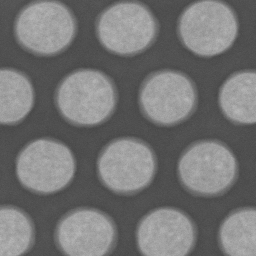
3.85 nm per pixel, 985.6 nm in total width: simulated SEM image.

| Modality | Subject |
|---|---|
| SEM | raised bodies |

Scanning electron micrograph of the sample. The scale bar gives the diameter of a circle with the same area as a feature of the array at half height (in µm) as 0.215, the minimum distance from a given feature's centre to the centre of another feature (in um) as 0.307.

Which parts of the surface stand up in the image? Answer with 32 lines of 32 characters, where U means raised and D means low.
DDDDUUUUDDDDDDDUUDDDDDDDUUUUDDDD
DDDUUUUUUDDDDUUUUUUDDDDUUUUUUDDD
DDUUUUUUUDDDUUUUUUUDDDDUUUUUUDDD
DDUUUUUUUDDDUUUUUUUUDDUUUUUUUUDD
DDUUUUUUUDDDUUUUUUUDDDDUUUUUUDDD
DDDUUUUUUDDDDUUUUUUDDDDUUUUUUDDD
DDDDUUUDDDDDDDUUUDDDDDDDUUUUDDDD
DDDDDDDDDDDDDDDDDDDDDDDDDDDDDDDD
DDDDDDDDDDDDDDDDDDDDDDDDDDDDDDDD
UUUDDDDDDUUUUDDDDDDUUUUDDDDDDUUU
UUUUDDDDUUUUUUDDDDUUUUUUDDDDUUUU
UUUUDDDUUUUUUUDDDDUUUUUUDDDDUUUU
UUUUDDDUUUUUUUDDDDUUUUUUDDDUUUUU
UUUUDDDUUUUUUUDDDDUUUUUUDDDDUUUU
UUUDDDDDUUUUUUDDDDUUUUUDDDDDUUUU
DDDDDDDDDDUUDDDDDDDDUDDDDDDDDDDD
DDDDDDDDDDDDDDDDDDDDDDDDDDDDDDDD
DDDDDUDDDDDDDDDUUDDDDDDDDDDDDDDD
DDDUUUUUDDDDDUUUUUUDDDDDUUUUDDDD
DDUUUUUUUDDDDUUUUUUDDDDUUUUUUDDD
DDUUUUUUUDDDUUUUUUUDDDUUUUUUUUDD
DDUUUUUUUDDDUUUUUUUDDDUUUUUUUUDD
DDUUUUUUUDDDDUUUUUUDDDDUUUUUUDDD
DDDDUUUUDDDDDDUUUUDDDDDUUUUUDDDD
DDDDDDDDDDDDDDDDDDDDDDDDDDDDDDDD
DDDDDDDDDDDDDDDDDDDDDDDDDDDDDDDD
UUUDDDDDDUUUDDDDDDDUUUUDDDDDDUUU
UUUUDDDDUUUUUUDDDDUUUUUUDDDDUUUU
UUUUDDDUUUUUUUDDDUUUUUUUDDDDUUUU
UUUUDDDUUUUUUUDDDUUUUUUUDDDUUUUU
UUUUDDDUUUUUUUDDDUUUUUUUDDDDUUUU
UUUDDDDDUUUUUDDDDDUUUUUUDDDDUUUU